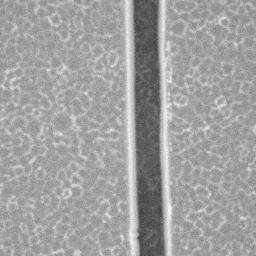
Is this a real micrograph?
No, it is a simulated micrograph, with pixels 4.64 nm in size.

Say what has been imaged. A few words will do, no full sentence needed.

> one or a few lines or trenches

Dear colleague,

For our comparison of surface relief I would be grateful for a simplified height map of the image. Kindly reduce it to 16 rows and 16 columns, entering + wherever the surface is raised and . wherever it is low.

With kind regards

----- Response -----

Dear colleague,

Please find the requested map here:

++++++++..++++++
++++++++..++++++
++++++++..++++++
++++++++..++++++
++++++++..++++++
++++++++..++++++
++++++++..++++++
++++++++..++++++
++++++++..++++++
++++++++..++++++
++++++++..++++++
++++++++..++++++
++++++++..++++++
++++++++..++++++
++++++++..++++++
++++++++..++++++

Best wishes